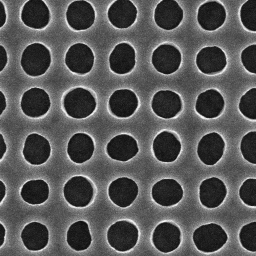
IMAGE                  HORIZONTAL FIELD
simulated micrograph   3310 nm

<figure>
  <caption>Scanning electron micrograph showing a regular array of holes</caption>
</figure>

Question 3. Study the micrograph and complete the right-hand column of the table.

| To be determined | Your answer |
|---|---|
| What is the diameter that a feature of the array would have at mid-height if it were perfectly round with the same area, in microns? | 0.385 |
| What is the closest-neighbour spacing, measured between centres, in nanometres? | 560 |